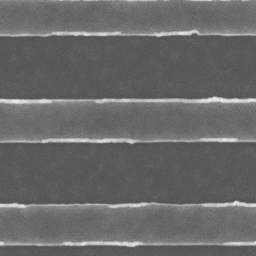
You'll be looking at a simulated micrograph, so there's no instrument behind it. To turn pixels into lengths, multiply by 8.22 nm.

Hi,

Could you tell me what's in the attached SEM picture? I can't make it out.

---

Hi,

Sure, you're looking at one or a few lines or trenches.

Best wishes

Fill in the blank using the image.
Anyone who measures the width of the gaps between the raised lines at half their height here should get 518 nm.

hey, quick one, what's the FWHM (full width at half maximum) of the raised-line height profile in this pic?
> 0.345 µm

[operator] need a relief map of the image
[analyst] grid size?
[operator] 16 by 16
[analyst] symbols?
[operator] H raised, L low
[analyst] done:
HHHHHHHHHHHHHHHH
HHHHHHHHHHHHHHHH
LLLLLLLLLLLLLLLL
LLLLLLLLLLLLLLLL
LLLLLLLLLLLLLLLL
LLLLLLLLLLLLLLLL
HHHHHHHHHHHHHHHH
HHHHHHHHHHHHHHHH
HHHHHHHHHHHHHHHH
LLLLLLLLLLLLLLLL
LLLLLLLLLLLLLLLL
LLLLLLLLLLLLLLLL
LLLLLLLLLLLLLLLL
HHHHHHHHHHHHHHHH
HHHHHHHHHHHHHHHH
LLLLLLLLLLLLLLLL